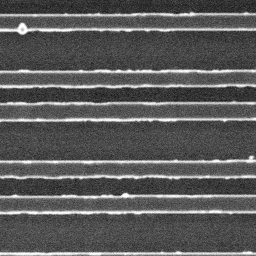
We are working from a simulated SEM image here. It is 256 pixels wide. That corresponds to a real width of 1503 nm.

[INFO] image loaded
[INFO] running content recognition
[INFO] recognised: lines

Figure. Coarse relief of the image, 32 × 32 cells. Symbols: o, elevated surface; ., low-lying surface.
................................
................................
oooooooooooooooooooooooooooooooo
oooooooooooooooooooooooooooooooo
................................
................................
................................
................................
................................
oooooooooooooooooooooooooooooooo
oooooooooooooooooooooooooooooooo
................................
................................
oooooooooooooooooooooooooooooooo
oooooooooooooooooooooooooooooooo
................................
................................
................................
................................
................................
oooooooooooooooooooooooooooooooo
oooooooooooooooooooooooooooooooo
................................
................................
.o......oo..o..ooooooooooooooooo
oooooooooooooooooooooooooooooooo
oooooooooooooooooooooooooooooooo
................................
................................
................................
................................
................................